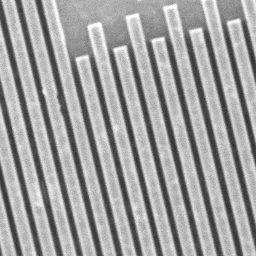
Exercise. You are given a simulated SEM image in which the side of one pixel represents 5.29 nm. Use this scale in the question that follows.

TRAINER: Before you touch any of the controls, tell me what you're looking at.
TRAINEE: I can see parallel lines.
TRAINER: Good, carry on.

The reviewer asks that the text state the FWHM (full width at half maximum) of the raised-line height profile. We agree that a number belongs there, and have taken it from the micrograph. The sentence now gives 12.4 px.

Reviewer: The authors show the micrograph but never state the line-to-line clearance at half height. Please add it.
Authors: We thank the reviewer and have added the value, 7.16 px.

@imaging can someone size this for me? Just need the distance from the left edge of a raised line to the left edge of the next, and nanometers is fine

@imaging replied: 103